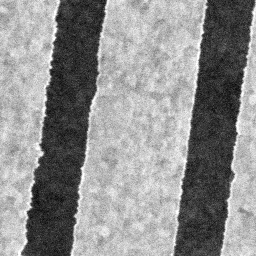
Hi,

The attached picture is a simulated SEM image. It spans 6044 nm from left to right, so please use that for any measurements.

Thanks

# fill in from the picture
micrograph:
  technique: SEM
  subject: one or a few lines or trenches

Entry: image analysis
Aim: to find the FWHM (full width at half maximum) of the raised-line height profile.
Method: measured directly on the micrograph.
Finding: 2340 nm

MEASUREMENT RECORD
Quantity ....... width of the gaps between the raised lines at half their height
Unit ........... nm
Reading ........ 1140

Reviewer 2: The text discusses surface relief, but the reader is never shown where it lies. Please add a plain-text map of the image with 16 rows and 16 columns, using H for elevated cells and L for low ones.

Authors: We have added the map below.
HHHHLLLHHHHHHLLL
HHHLLLLHHHHHHLLL
HHHLLLHHHHHHHLLL
HHHLLLHHHHHHLLLL
HHHLLLHHHHHHLLLH
HHHLLLHHHHHHLLLH
HHHLLLHHHHHHLLLH
HHHLLLHHHHHHLLLH
HHHLLLHHHHHHLLLH
HHHLLHHHHHHHLLLH
HHLLLHHHHHHHLLLH
HHLLLHHHHHHLLLLH
HHLLLHHHHHHLLLHH
HHLLLHHHHHHLLLHH
HHLLLHHHHHHLLLHH
HLLLLHHHHHHLLLHH